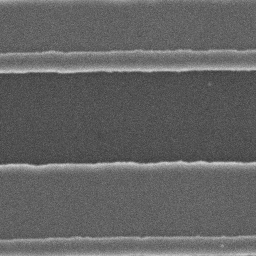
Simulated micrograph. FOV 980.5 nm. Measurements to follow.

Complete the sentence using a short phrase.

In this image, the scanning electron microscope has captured lines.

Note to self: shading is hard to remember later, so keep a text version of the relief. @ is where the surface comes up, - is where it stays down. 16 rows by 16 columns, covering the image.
@@@@@@@@@@@@@@@@
@@@@@@@@@@@@@@@@
@@@@@@@@@@@@@@@@
@@@@@@@@@@@@@@@@
@@-@@-----------
----------------
----------------
----------------
----------------
----------------
@@@@@@@@@@@@@@@@
@@@@@@@@@@@@@@@@
@@@@@@@@@@@@@@@@
@@@@@@@@@@@@@@@@
@@@@@@@@@@@@@@@@
@@@@@@@@@@@@@@@@